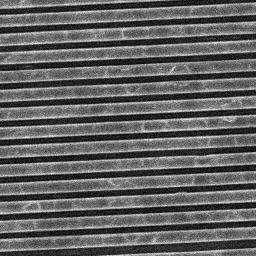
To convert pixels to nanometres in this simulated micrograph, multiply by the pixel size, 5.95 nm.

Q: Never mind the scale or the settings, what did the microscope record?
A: parallel lines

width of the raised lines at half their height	69.1	nm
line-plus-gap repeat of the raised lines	0.111	um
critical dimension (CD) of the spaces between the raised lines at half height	42.4	nanometers